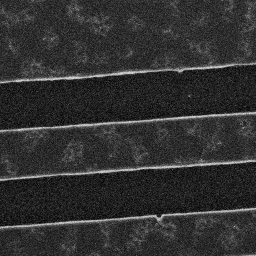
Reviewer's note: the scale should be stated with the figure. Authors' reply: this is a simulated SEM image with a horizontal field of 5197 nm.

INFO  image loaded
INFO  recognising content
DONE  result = one or a few lines or trenches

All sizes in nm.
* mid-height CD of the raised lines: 981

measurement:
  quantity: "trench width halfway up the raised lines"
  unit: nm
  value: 980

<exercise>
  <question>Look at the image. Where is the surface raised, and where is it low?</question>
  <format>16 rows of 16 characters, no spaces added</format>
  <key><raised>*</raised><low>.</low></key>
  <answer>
****************
****************
****************
****************
*********.......
................
................
..........******
****************
****************
*********.......
................
................
..........******
****************
****************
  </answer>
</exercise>